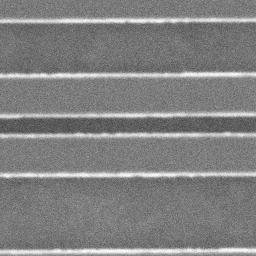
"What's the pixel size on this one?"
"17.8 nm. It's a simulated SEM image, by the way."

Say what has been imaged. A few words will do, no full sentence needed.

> lines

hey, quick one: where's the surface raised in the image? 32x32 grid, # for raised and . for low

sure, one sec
################################
################################
################################
................................
................................
................................
................................
................................
................................
################################
################################
################################
################################
################################
#####################...........
................................
................................
################################
################################
################################
################################
################################
................................
................................
................................
................................
................................
................................
................................
................................
................................
################################